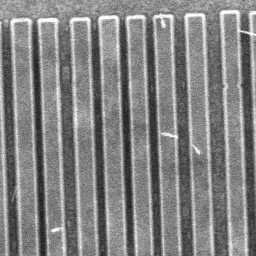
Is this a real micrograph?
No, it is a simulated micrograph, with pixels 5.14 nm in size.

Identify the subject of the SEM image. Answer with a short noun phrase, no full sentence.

parallel lines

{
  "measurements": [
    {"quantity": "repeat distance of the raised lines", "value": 154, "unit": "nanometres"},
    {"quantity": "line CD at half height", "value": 95.6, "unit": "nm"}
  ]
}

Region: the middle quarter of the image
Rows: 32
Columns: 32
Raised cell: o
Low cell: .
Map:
..ooooo..ooooo..oooo...oooo....o
..ooooo..ooooo..oooo...oooo....o
..ooooo..ooooo..ooooo..oooo....o
..ooooo..ooooo..ooooo..ooooo...o
..ooooo..ooooo..ooooo..ooooo...o
..ooooo..ooooo..ooooo..ooooo...o
..ooooo..ooooo..ooooo..ooooo...o
...oooo...oooo..ooooo..ooooo...o
...oooo...oooo..ooooo..ooooo...o
...oooo...oooo...oooo..ooooo...o
...oooo...oooo...oooo..ooooo...o
...oooo...oooo...oooo..ooooo...o
...oooo...oooo...oooo..ooooo...o
...oooo...oooo...oooo..ooooo...o
...oooo...oooo...oooo..ooooo...o
...oooo...oooo...oooo...oooo...o
...oooo...oooo...oooo...oooo...o
...oooo...ooooo..oooo...oooo....
...oooo...ooooo..oooo...oooo....
...oooo...ooooo..oooo...oooo....
...oooo...ooooo..oooo...oooo....
...oooo...ooooo..oooo...oooo....
...ooooo..ooooo..oooo...oooo....
...ooooo..ooooo..oooo...oooo....
...ooooo..ooooo..oooo...oooo....
...ooooo..ooooo..oooo...oooo....
...ooooo..ooooo..oooo...oooo....
...ooooo..ooooo..oooo...oooo....
...ooooo..ooooo..oooo...oooo....
...ooooo..ooooo..oooo...oooo....
...ooooo..ooooo..ooooo..ooooo...
...ooooo..ooooo..ooooo..ooooo...